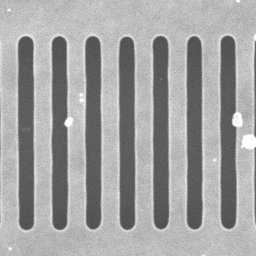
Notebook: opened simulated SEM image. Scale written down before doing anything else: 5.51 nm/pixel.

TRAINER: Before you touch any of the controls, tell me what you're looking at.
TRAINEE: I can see groups of lines, slits or small figures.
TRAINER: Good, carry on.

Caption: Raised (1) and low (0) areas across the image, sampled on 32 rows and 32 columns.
11111111111111111111111111111111
11111111111111111111111111111111
11111111111111111111111111111111
11111111111111111111111111111111
11111111111111111111111111110111
11001100111001100110011001100111
11001100111001100110011001100011
11001100111001100110011001100011
11001100111001100110011001100011
11001100111001100110011001100011
11001100011001100110011001100011
11001100011001100110011001100011
11001100011001100110011001100011
11001100011001100110011001100011
11001100111001100110011001100111
11001100111001100110011001100111
11001100011001100110011001100011
11001100011001100110011001100011
11001100011001100110011001100011
11001100011001100110011001110011
11001100011001100110011001100011
11001100011001100110011001100011
11001100011001100110011001100011
11001100011001100110011001100011
11001100011001100110011001100011
11001100011001100110011001100011
11001100011001100110011001100011
11001100111001100110011001110011
11101110111011101111011101110111
11111111111111111111111111111111
11111111111111111111111111111111
11111111111111111111111111111111